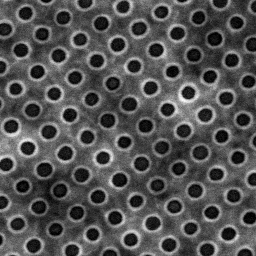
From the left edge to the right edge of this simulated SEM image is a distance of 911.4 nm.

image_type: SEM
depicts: a regular array of holes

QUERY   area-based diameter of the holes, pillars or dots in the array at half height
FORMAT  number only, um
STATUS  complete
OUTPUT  0.0534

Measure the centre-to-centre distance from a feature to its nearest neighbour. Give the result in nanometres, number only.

94.8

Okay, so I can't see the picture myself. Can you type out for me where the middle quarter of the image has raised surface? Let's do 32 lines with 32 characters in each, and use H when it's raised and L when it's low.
HHHHHHHLLLHHHHHHLLLHHHHHHHLLHHHH
HHHHHHHHHHHHHHHHLLLHHHHHHLLLLHHH
HLLLLHHHHHHHHHHHHHHHHHHHHLLLLHHH
HLLLLHHHHHHLLLHHHHHHHHHHHHLLHHHH
HLLLHHHHHHLLLLHHHHHHHLLHHHHHHHHH
HHHHHHHHHHLLLLHHHHHHLLLHHHHHHHLL
HHHHHHHHHHHLLHHHHHHHLLLLHHHHHLLL
HHHHHHLLHHHHHHHHHHHHLLLHHHHHHLLL
HHHHHLLLLHHHHHHLLLHHHHHHHHHHHHLL
HHHHHLLLLHHHHHLLLLHHHHHHHHHHHHHH
HHHHHHLHHHHHHHLLLLHHHHHHLLLLHHHH
LLLHHHHHHHHHHHHLLLHHHHHHLLLLHHHH
LLLHHHHHHHLLHHHHHHHHHHHHLLLHHHHH
LLLHHHHHHLLLLHHHHHHHHHHHHHHHHHHH
HLHHHHHHHLLLLHHHHHHLLLHHHHHHHHHH
HHHHHHHHHLLLHHHHHHHLLLHHHHHHLLLL
HHHHHLHHHHHHHHHHHHHLLLHHHHHHLLLL
HHHHLLLLHHHHHHHHHHHHHHHHHHHHLLLL
HHHHLLLLHHHHHHLLLHHHHHHHHHHHHLLH
HHHHLLLHHHHHHLLLLHHHHHHLLLHHHHHH
LHHHHHHHHHHHHLLLLHHHHHLLLLHHHHHH
LLHHHHHHHHHHHHHHHHHHHHHLLLHHHHHH
LLHHHHHHLLLLHHHHHHHHHHHLLHHHHHHH
LLHHHHHHLLLLHHHHHHLLLHHHHHHHHHHH
HHHHHHHHLLLLHHHHHLLLLHHHHHHHLLHH
HHHHHHHHHHHHHHHHHLLLLHHHHHHLLLHH
HHHLLLHHHHHHHHHHHHLLLHHHHHHLLLHH
HHLLLLLHHHHHHLLHHHHHHHHHHHHLLLHH
HHLLLLHHHHHHLLLLHHHHHHHHHHHHHHHH
HHHLLHHHHHHHLLLLHHHHHHLLLHHHHHHH
LHHHHHHHHHHHLLLHHHHHHLLLLHHHHHHL
LHHHHHHHLHHHHHHHHHHHHHLLLHHHHHHL